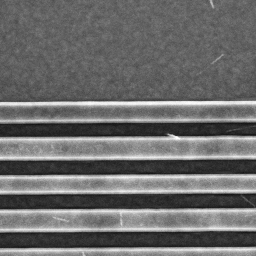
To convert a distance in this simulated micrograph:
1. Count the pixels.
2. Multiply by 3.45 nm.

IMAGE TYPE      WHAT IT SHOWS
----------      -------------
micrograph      parallel lines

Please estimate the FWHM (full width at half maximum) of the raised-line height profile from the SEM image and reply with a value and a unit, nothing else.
0.0666 µm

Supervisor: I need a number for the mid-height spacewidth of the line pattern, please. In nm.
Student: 60.8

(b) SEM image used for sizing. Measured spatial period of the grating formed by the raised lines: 0.124 micrometres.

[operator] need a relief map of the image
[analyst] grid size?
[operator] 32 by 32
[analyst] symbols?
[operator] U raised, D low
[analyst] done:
DDDDDDDDDDDDDDDDDDDDDDDDDDDDDDDD
DDDDDDDDDDDDDDDDDDDDDDDDDDDDDDDD
DDDDDDDDDDDDDDDDDDDDDDDDDDDDDDDD
DDDDDDDDDDDDDDDDDDDDDDDDDDDDDDDD
DDDDDDDDDDDDDDDDDDDDDDDDDDDDDDDD
DDDDDDDDDDDDDDDDDDDDDDDDDDDDDDDD
DDDDDDDDDDDDDDDDDDDDDDDDDDDDDDDD
DDDDDDDDDDDDDDDDDDDDDDDDDDDDDDDD
DDDDDDDDDDDDDDDDDDDDDDDDDDDDDDDD
DDDDDDDDDDDDDDDDDDDDDDDDDDDDDDDD
DDDDDDDDDDDDDDDDDDDDDDDDDDDDDDDD
DDDDDDDDDDDDDDDDDDDDDDDDDDDDDDDD
DDDDDDDDDDDDDDDDDDDDDDDDDDDDDDDD
UUUUUUUUUUUUUUUUUUUUUUUUUUUUUUUU
UUUUUUUUUUUUUUUUUUUUUUUUUUUUUUUU
DDDDDDDDDDDDDDDDDDDDDDDDDDDDDDDD
DDDDDDDDDDDDDDDDDDDDDDDDDDDDDDDD
UUUUUUUUUUUUUUUUUUUUUUUUUUUUUUUU
UUUUUUUUUUUUUUUUUUUUUUUUUUUUUUUU
UUUUUUUUUUUUUUUUUUUUUUUUUUUUUUUU
DDDDDDDDDDDDDDDDDDDDDDDDDDDDDDDD
DDDDDDDDDDDDDDDDDDDDDDDDDDDDDDDD
UUUUUUUUUUUUUUUUUUUUUUUUUUUUUUUU
UUUUUUUUUUUUUUUUUUUUUUUUUUUUUUUU
DDDDDDDDDDDDDDDDDDDDDDDDDDDDDDDD
DDDDDDDDDDDDDDDDDDDDDDDDDDDDDDDD
UUUUUUUUUUUUUUUUUUUUUUUUUUUUUUUU
UUUUUUUUUUUUUUUUUUUUUUUUUUUUUUUU
UUUUUUUUUUUUUUUUUUUUUUUUUUUUUUUU
DDDDDDDDDDDDDDDDDDDDDDDDDDDDDDDD
DDDDDDDDDDDDDDDDDDDDDDDDDDDDDDDD
UUUUUUUUUUUUUUUUUUUUUUUUUUUUUUUU